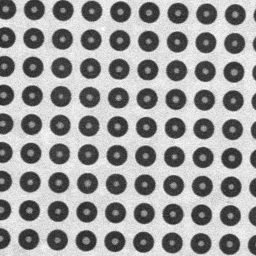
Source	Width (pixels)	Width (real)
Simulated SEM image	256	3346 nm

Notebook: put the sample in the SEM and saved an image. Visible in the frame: an array of small figures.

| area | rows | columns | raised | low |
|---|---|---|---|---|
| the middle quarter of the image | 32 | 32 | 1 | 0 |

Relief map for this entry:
00110000011000001100000111000001
00110000011000001100000010000001
00110000011000001100000111000001
01111000111100011110000111000011
11111111111111111111111111111111
11111101111111111111111111111111
01111000111100011110001111000111
00110000011000001100000111000011
00110000011000001100100110000001
01110000011000001100000110000001
11111000111100001110000111000011
11111111111111111111111111100111
11111111111111111111111111111111
01110000111100011110001111101111
00110000011000001100000110000011
00110000011001001100000110000011
00110000011000001100000110000011
01110000111000011100000110000011
11111111111111111111011111100111
11111111111111111111111111111111
01110000111100011110011111101111
01110000011000001100000110000011
00100000011000001100000110000011
01100000011000001100000110000011
01110000111000011100000110000011
11111111111100111111011111000111
11111111111111111111111111111111
11111001111100111111011111111111
01100000111000011100001111000111
01100000010000001100000110000011
01100000010000001000000110010011
01110000111000011100000110000011